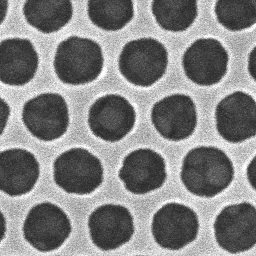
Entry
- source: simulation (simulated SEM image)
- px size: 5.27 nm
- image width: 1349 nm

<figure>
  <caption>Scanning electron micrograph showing a regular array of holes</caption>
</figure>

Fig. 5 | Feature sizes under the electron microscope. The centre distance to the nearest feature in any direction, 63.2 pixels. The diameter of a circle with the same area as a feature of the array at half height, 253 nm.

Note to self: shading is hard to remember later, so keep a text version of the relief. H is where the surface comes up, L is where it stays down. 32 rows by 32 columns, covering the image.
LHHLLLLLLHHLLLLLLHHLLLLLLHHLLLLL
LHHLLLLLLHHLLLLLLHHLLLLLLHHLLLLL
LHHLLLLLLHHLLLLLHHHLLLLLHHHLLLLL
HHHHLLLLHHHHLLLHHHHHLLLLHHHHLLLH
HHHHHHHHHLHHHHHHHHHHHHHHHHHHHHHH
LLLLHHHLLLLLHHHHLLLLHHHHLLLLHHHH
LLLLLHHLLLLLLHHLLLLLLHHLLLLLHHHL
LLLLLHHLLLLLLHHLLLLLLHHLLLLLLHHL
LLLLLHHLLLLLLHHLLLLLLHHLLLLLHHHL
LLLLHHHLLLLLHHHLLLLLHHHLLLLLHHHL
HLLHHHHHLLHHHHHHLLLHHHHHHLLHHHHH
HHHHHHHHHHHHHHHHHHHHHHHHHHHHHLHH
HHHHLLLLHHHHLLLLHHHHLLLLHHHHLLLL
LHHLLLLLHHHLLLLLLHHLLLLLHHHLLLLL
LHHLLLLLLHHLLLLLLHHLLLLLLHHLLLLL
LHHLLLLLLHHLLLLLLHHLLLLLLHHLLLLL
HHHHLLLLHHHHLLLLHHHHLLLLHHHLLLLL
HHHHHLLHHHHHHLLHHHHHHLLHHHHHLLLH
HHLHHHHHHLHHHHHHHHHHHHHHLLLHHHHH
LLLLHHHLLLLLHHHHLLLLHHHLLLLLHHHH
LLLLLHHLLLLLLHHLLLLLLHHLLLLLLHHL
LLLLLHHLLLLLLHHLLLLLLHHLLLLLLHHL
LLLLLHHLLLLLLHHLLLLLLHHLLLLLLHHL
LLLLHHHHLLLLHHHHLLLLHHHLLLLLHHHH
HLHHHHHHHHHHHHHHHHHHHHHHHLLHHHHH
HHHHHLLHHHHHHHHHHHHHHLLHHHHHHLLH
HHHHLLLLHHHHLLLLHHHHLLLLHHHHLLLL
LHHLLLLLLHHLLLLLLHHLLLLLLHHLLLLL
LHHLLLLLLHHLLLLLLHHLLLLLLHHLLLLL
HHHLLLLLLHHLLLLLLHHLLLLLLHHLLLLL
HHHHLLLLHHHHLLLHHHHHLLLLHHHLLLLL
HHHHHLHHHHHHHHHHHHHHHHHHHHHHHLHH